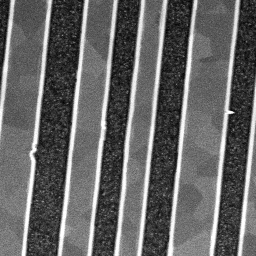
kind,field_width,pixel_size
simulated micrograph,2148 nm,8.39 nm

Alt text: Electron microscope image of one or a few lines or trenches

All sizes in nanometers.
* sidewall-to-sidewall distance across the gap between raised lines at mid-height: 245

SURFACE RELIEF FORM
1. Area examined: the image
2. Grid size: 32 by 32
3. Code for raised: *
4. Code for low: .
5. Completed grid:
..****.....***....***...******..
.*****.....***....***...******..
.*****.....***....**....******..
.*****....****....**....*****...
.*****....****...***....*****...
.*****....****...***....*****...
.*****....****...***....*****...
.****.....****...***....*****...
.****.....****...***....*****...
.****.....****...***...******...
.****.....****...***...******...
*****.....***....***...*****....
*****.....***....**....*****....
*****....****...***....*****....
*****....****...***....*****....
*****....****...***....*****....
*****....****...***....*****....
****.....****...***....*****...*
****.....****...***....*****...*
****.....***....***...******...*
****.....***....***...******...*
****.....***....***...******...*
****....****...***....*****....*
****....****...***....*****....*
****....****...***....*****....*
****....****...***....*****....*
****....****...***....*****....*
***.....****...***....*****...**
***.....****...***....*****...**
***.....***....***...******...**
***.....***....***...******...**
***.....***....**....******...**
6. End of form